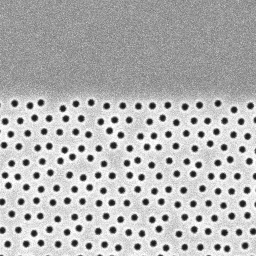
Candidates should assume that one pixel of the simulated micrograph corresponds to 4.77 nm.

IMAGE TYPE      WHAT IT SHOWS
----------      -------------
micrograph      a regular array of holes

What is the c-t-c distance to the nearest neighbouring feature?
64.1 nanometres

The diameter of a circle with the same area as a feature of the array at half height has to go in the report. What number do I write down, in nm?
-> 34